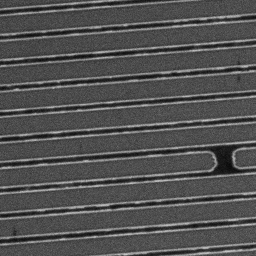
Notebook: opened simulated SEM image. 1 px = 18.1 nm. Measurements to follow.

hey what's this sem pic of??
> parallel lines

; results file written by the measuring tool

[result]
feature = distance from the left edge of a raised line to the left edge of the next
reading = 461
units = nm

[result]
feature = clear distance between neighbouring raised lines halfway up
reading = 339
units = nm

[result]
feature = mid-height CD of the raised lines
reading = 6.23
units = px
